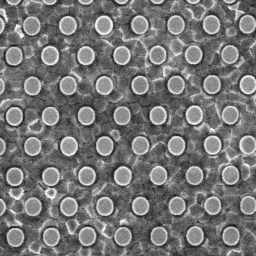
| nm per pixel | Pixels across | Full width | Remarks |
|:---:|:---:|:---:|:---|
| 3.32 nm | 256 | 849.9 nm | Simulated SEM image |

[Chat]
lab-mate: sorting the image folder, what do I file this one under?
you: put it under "a regular array of raised bodies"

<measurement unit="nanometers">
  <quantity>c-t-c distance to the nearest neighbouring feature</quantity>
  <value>116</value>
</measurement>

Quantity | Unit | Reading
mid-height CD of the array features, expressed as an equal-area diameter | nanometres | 58.5